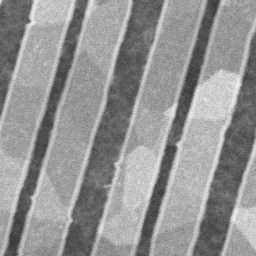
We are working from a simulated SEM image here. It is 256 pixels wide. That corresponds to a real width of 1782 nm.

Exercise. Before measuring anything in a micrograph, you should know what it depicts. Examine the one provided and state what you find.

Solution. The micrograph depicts one or a few lines or trenches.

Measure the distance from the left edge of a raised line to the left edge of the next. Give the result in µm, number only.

0.429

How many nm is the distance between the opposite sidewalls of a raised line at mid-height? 261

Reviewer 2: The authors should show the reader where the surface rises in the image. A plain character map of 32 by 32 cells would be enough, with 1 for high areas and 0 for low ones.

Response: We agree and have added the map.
00001111100111110000011110001111
00001111100111110000111110011111
00001111100111110000111110011111
00001111001111100000111110011111
00011111001111100000111100011110
00011111001111100001111100111110
00011110001111000001111100111110
00111110011111000001111000111110
00111110011111000011111001111100
00111110011111000011111001111100
00111100111110000011111001111100
01111100111110000011110001111000
01111100111110000111110011111000
01111001111110000111110011111000
11111001111100000111110011111000
11111001111100001111100111110000
11110001111100001111100111110000
11110001111000001111100111110000
11110011111000001111001111100000
11110011111000011111001111100000
11100011111000011111001111100001
11100111110000011111001111100001
11100111110000111110011111000001
11000111110000111110011111000011
11001111100000111110011111000011
11001111100001111100011110000011
11001111100001111100111110000111
10001111100001111100111110000111
10011111000001111000111110000111
10011111000011111001111100000111
10011111000011111001111100001111
00011111000011111001111100001111